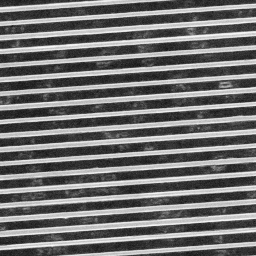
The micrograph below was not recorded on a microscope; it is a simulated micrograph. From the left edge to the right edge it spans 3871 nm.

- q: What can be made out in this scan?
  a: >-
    parallel lines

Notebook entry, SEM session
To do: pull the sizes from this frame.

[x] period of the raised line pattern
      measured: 0.211 um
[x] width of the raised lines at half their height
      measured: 58.4 nanometres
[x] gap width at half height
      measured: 9.72 pixels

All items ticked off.